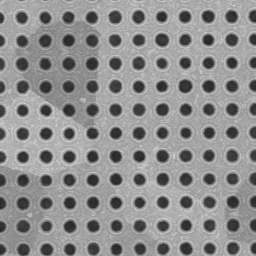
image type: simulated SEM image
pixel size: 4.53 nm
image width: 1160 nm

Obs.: a regular array of holes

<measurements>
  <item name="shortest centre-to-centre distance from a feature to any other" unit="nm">104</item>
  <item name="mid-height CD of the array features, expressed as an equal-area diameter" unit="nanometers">63.8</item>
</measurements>